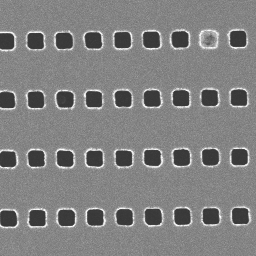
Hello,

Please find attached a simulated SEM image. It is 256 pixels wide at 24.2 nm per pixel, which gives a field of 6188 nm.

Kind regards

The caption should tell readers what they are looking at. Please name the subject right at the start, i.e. a regular array of holes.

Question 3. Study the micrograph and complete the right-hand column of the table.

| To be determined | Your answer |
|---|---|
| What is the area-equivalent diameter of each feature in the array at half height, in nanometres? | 434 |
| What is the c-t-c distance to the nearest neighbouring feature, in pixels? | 28.7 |